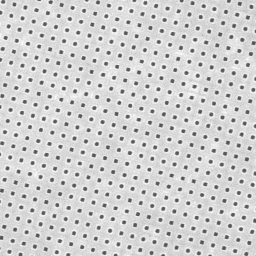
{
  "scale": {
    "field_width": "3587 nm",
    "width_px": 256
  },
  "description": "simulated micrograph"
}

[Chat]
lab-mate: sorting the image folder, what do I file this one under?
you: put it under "a regular array of holes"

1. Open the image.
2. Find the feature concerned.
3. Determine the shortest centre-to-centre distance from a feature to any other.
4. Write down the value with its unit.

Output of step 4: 11.2 px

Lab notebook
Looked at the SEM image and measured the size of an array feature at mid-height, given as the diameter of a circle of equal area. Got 67.1 nm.